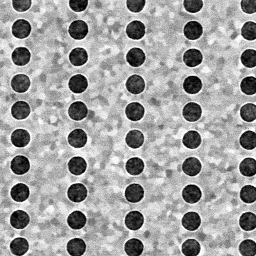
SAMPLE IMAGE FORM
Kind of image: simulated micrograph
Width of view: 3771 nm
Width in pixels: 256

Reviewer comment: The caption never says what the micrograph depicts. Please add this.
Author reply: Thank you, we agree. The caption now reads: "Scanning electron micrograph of a regular array of holes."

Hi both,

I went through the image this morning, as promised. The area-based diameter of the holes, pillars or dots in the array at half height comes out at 19.5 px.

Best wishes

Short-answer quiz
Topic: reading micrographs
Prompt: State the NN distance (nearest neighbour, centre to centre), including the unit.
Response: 398 nm